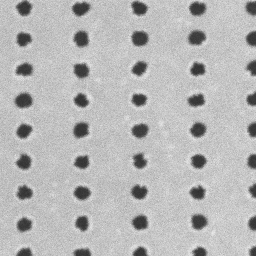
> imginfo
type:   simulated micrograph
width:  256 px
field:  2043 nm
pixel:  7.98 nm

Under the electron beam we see a regular array of holes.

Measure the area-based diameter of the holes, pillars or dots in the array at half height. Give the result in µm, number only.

0.119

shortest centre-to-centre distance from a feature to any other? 243 nm